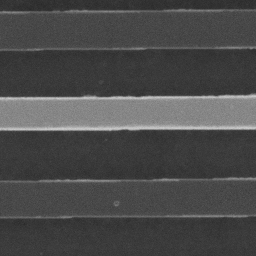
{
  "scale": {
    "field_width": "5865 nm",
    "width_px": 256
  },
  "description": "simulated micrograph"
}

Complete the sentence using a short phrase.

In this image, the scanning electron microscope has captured lines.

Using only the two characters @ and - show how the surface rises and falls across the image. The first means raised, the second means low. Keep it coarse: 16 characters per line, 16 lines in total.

----------------
@@@@@@@@@@@@@@@@
@@@@@@@@@@@@@@@@
----------------
----------------
----------------
@@@@@@@@@@@@@@@@
@@@@@@@@@@@@@@@@
----------------
----------------
----------------
@@@@@@@@@@@@@@@@
@@@@@@@@@@@@@@@@
@@@@@@@@@@@@@@@@
----------------
----------------